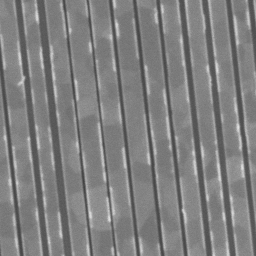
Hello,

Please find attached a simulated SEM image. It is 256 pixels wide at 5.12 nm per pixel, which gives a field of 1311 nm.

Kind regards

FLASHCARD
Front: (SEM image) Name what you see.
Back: parallel lines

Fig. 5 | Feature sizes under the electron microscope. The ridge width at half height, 94.8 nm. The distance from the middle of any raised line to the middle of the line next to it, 120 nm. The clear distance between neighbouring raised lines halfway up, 0.0255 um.